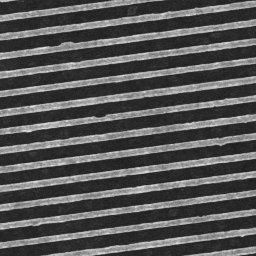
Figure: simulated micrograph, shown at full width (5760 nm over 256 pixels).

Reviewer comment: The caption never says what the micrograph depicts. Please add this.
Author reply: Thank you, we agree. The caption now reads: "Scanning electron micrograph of parallel lines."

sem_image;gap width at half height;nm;304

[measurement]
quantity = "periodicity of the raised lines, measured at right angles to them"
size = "0.422 microns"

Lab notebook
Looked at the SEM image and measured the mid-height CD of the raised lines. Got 123 nanometers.